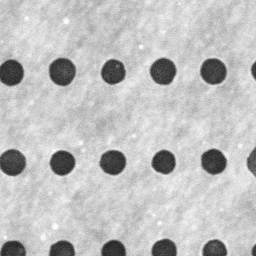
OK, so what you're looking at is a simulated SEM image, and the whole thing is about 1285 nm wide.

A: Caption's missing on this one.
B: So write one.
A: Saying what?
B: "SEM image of a regular array of holes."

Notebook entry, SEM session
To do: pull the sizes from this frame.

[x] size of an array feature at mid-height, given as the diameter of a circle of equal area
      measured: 135 nm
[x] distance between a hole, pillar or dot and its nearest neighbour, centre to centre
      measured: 251 nm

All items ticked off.